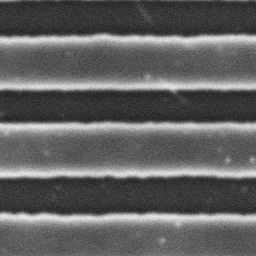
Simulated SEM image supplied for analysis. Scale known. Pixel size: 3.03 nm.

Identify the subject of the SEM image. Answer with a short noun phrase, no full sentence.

lines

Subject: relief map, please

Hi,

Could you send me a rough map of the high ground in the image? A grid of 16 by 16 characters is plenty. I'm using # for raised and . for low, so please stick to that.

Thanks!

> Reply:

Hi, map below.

................
................
################
################
################
################
................
................
################
################
################
................
................
###....####..##.
################
################